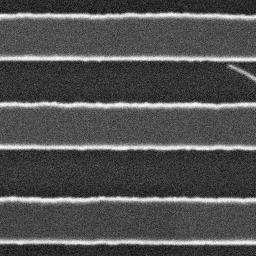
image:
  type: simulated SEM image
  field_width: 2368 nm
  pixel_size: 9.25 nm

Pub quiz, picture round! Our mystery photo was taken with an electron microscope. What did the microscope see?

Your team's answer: lines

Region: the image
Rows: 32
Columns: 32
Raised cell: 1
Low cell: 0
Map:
00000000000000000000000000000000
00000000000000000000000000000000
11111111111111111111111111111111
11111111111111111111111111111111
11111111111111111111111111111111
11111111111111111111111111111111
11111111111111111111111111111111
00000000001000000000001111111111
00000000000000000000000000000000
00000000000000000000000000000000
00000000000000000000000000000000
00000000000000000000000000000000
00000000000000000000000000000000
11111111111111111111111111111111
11111111111111111111111111111111
11111111111111111111111111111111
11111111111111111111111111111111
11111111111111111111111111111111
11111111111111111111111111111111
00000000000000000000000000000000
00000000000000000000000000000000
00000000000000000000000000000000
00000000000000000000000000000000
00000000000000000000000000000000
00000000000000000000000000000000
11111111111111111111111111111111
11111111111111111111111111111111
11111111111111111111111111111111
11111111111111111111111111111111
11111111111111111111111111111111
00000000000000000000000000000000
00000000000000000000000000000000